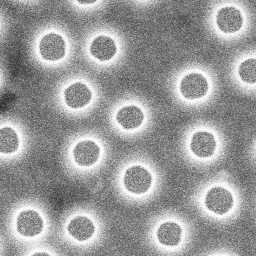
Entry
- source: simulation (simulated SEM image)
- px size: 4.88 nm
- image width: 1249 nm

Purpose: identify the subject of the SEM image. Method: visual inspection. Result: a regular array of holes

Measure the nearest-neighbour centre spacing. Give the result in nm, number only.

276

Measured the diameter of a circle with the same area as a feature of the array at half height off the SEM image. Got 0.135 microns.